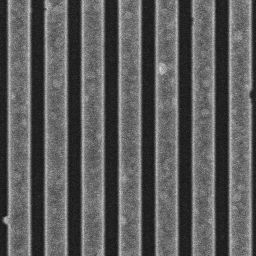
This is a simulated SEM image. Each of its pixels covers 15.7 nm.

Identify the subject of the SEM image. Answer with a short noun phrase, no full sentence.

parallel lines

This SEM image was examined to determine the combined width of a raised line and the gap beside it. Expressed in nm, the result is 578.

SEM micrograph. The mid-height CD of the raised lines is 344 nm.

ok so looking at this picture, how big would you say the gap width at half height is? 0.226 microns